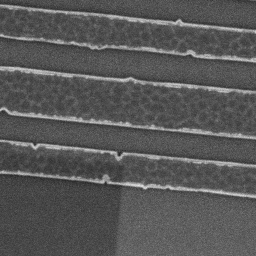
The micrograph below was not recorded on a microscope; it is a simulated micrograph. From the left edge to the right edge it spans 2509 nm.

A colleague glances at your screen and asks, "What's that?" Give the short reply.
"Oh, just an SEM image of one or a few lines or trenches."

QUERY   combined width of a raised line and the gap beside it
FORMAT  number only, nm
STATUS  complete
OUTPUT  660